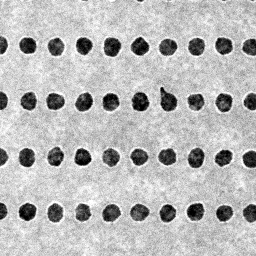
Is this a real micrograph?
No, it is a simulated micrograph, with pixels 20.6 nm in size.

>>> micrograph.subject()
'a regular array of holes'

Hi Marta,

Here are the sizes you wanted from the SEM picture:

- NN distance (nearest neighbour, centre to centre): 572 nm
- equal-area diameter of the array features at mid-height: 0.388 microns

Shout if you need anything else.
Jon